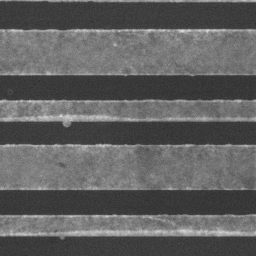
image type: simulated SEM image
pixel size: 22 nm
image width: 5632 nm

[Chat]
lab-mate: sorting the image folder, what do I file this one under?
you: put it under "lines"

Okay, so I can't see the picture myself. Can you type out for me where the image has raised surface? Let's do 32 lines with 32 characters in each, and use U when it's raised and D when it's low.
DDDDDDDDDDDDDDDDDDDDDDDDDDDDDDDD
DDDDDDDDDDDDDDDDDDDDDDDDDDDDDDDD
DDDDDDDDDDDDDDDDDDDDDDDDDDDDDDDD
DDDDDDDDDDDDDDDDDDDDDDDDDDDDDDDD
UUUUUUUUUUUUUUUUUUUUUUUUUUUUUUUU
UUUUUUUUUUUUUUUUUUUUUUUUUUUUUUUU
UUUUUUUUUUUUUUUUUUUUUUUUUUUUUUUU
UUUUUUUUUUUUUUUUUUUUUUUUUUUUUUUU
UUUUUUUUUUUUUUUUUUUUUUUUUUUUUUUU
DDDDDDDDDDDDDDDDDDDDDDDDDDDDDDDD
DDDDDDDDDDDDDDDDDDDDDDDDDDDDDDDD
DDDDDDDDDDDDDDDDDDDDDDDDDDDDDDDD
DDDDDDDDDDDDDDDDDDDDDDDDDDDDDDDD
UUUUUUUUUUUUUUUUUUUUUUUUUUUUUUUU
UUUUUUUUUUUUUUUUUUUUUUUUUUUUUUUU
DDDDDDDDDDDDDDDDDDDDDDDDDDDDDDDD
DDDDDDDDDDDDDDDDDDDDDDDDDDDDDDDD
DDDDDDDDDDDDDDDDDDDDDDDDDDDDDDDD
UUUUUUUUUUUUUUUUUUUUUUUUUUUUUUUU
UUUUUUUUUUUUUUUUUUUUUUUUUUUUUUUU
UUUUUUUUUUUUUUUUUUUUUUUUUUUUUUUU
UUUUUUUUUUUUUUUUUUUUUUUUUUUUUUUU
UUUUUUUUUUUUUUUUUUUUUUUUUUUUUUUU
UUUUUUUUUUUUUUUUUUUUUUUUUUUUUUUU
DDDDDDDDDDDDDDDDDDDDDDDDDDDDDDDD
DDDDDDDDDDDDDDDDDDDDDDDDDDDDDDDD
DDDDDDDDDDDDDDDDDDDDDDDDDDDDDDDD
UUUUUUUUUUUUUUUUUUUUUUUUUUUUUUUU
UUUUUUUUUUUUUUUUUUUUUUUUUUUUUUUU
DDDDDDDDDDDDDDDDDDDDDDDDDDDDDDDD
DDDDDDDDDDDDDDDDDDDDDDDDDDDDDDDD
DDDDDDDDDDDDDDDDDDDDDDDDDDDDDDDD